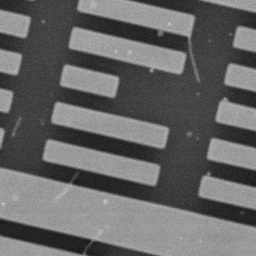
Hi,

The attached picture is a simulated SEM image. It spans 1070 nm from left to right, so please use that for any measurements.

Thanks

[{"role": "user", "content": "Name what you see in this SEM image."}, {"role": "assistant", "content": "groups of lines, slits or small figures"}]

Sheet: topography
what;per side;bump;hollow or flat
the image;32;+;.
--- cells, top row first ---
..........++++++++.........+++++
+.........++++++++++++..........
++++...........+++++++++........
+++................+++++......+.
..+......+++++.........+.....+++
.........+++++++++...........+++
+..........++++++++++++.........
+++............++++++++.........
++......++.........++++.....+++.
........++++++..............++++
........+++++++.............++++
+..........+++..................
+...............................
+......+++.................+++++
.......++++++++............+++++
.......++++++++++++.........++++
...........++++++++++...........
................+++++......+....
......+++++...............++++++
.....++++++++++...........++++++
.......++++++++++++..........+++
++..........++++++++............
++++++..........++++.....+++....
+++++++++++..............+++++++
+++++++++++++++..........+++++++
+++++++++++++++++++..........+++
++++++++++++++++++++++++........
.+++++++++++++++++++++++++++....
.....+++++++++++++++++++++++++++
.........+++++++++++++++++++++++
++++..........++++++++++++++++++
+++++++++.........++++++++++++++